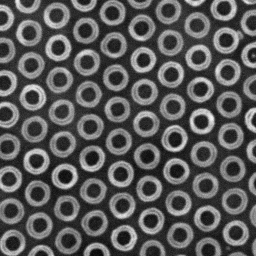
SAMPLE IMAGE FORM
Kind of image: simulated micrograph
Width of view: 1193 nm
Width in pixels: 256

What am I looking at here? a regular array of ring-shaped raised bodies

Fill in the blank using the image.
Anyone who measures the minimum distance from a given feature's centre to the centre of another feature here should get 31.5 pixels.